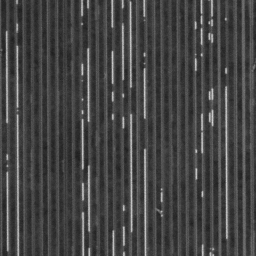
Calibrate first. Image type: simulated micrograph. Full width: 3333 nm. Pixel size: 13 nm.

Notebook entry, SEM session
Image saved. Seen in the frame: parallel lines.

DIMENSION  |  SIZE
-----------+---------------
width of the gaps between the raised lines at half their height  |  76.5 nm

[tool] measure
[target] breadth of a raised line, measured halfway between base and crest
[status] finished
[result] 26 nm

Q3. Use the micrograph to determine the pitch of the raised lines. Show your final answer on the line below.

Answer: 106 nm